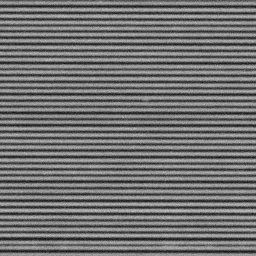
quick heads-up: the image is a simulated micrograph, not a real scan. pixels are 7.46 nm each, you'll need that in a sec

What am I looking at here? parallel lines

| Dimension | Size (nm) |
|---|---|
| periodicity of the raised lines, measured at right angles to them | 46.9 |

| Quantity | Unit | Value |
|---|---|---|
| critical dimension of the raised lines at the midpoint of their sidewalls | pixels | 3.75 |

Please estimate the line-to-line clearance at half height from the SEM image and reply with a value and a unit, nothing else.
20.5 nm